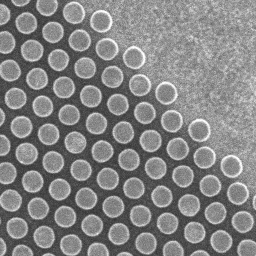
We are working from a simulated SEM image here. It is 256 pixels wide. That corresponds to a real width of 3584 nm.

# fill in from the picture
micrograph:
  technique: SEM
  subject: a regular array of raised bodies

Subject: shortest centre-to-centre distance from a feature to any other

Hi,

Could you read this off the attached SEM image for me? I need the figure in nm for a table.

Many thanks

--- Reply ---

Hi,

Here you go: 390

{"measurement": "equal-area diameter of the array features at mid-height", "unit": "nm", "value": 295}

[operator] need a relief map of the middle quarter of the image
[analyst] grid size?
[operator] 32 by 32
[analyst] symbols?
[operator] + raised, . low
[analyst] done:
+..+++++........+++.............
...+++++..++++..................
...+++++..+++++.................
+....+....+++++..++++...........
++........++++..+++++...........
+++...+....+++..+++++...+++.....
+++..++++........++++..+++++....
++..+++++........++++..+++++....
....+++++..++++........+++++....
.....++++..+++++........+++.....
+++...++...+++++..++++..........
+++........+++++..+++++.........
++++...++....+....+++++..++++...
++++..++++........+++++..++++...
+++...+++++...+....+++..+++++...
......++++...++++........++++...
......++++..+++++.........++...+
.+++........+++++...++++........
.++++........++++..+++++........
+++++....++...++...+++++..++++..
+++++..+++++.......+++++..+++++.
.++++..+++++...++...+++...+++++.
.......+++++..++++........+++++.
.......+++++..+++++...++...+++..
...+++........+++++..++++.......
..+++++.......++++..+++++.....+.
..+++++..+++....+...++++++..++++
..+++++..++++........++++..+++++
...+++..++++++...+....++...+++++
+.......++++++.++++.........++++
+........++++..+++++.........++.
+...+++........+++++..++++......